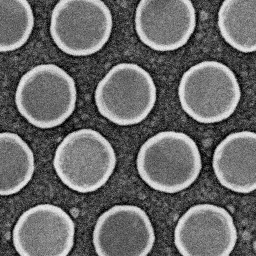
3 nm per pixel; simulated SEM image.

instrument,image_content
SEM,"raised bodies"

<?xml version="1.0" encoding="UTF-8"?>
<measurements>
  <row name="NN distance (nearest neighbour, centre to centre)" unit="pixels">78.2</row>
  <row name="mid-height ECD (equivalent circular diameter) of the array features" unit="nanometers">170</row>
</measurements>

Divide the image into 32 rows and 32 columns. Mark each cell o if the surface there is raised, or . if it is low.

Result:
ooo.....ooooo.....oooooo....oooo
oooo...oooooo....ooooooo....oooo
oooo...ooooooo...ooooooo....oooo
oooo...ooooooo...ooooooo....oooo
ooo....oooooo.....ooooo.....oooo
oo......ooooo......ooo.......ooo
.........oo.....................
................................
.....oo........oo.......oooo....
....oooo......oooo.....oooooo...
...oooooo....oooooo....oooooo...
..ooooooo...ooooooo....ooooooo..
..ooooooo...ooooooo....ooooooo..
...oooooo....oooooo....oooooo...
...ooooo......oooo......oooo....
.....o..........................
..........o.....................
oo......ooooo......oooo.....oooo
ooo.....oooooo....oooooo...ooooo
oooo...ooooooo....ooooooo..ooooo
oooo...ooooooo....ooooooo..ooooo
oooo...ooooooo....ooooooo..ooooo
ooo.....ooooo.....oooooo....oooo
oo........oo........oo.......ooo
................................
................................
....oooo......ooo.......oooo....
...oooooo....ooooo.....oooooo...
..ooooooo...ooooooo...ooooooo...
..ooooooo...ooooooo...ooooooo...
..ooooooo...ooooooo...ooooooo...
...ooooo....oooooo.....ooooo....